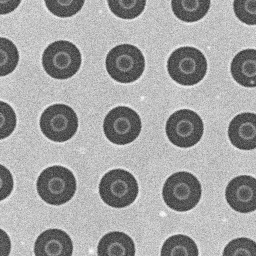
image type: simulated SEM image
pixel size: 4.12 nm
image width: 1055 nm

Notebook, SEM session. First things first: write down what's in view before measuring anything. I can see an array of small figures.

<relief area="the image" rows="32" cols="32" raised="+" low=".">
...+++....+++.....+++.....+++...
..++++....++++....++++....+++...
++++++++++++++++++++++...+++++..
++++++++++++++++++++++++++++++++
++++++++++++++++++++++++++++++++
..++++...++++++.++++++++++++++++
..+++.....++++....+++....+++++..
..+++.....+++.....+++.....+++...
..+++.....+++.....+++.....+++...
.+++++...+++++....+++.....+++...
++++++++++++++++++++++...+++++..
++++++++++++++++++++++++++++++++
++++++++++++++++++++++++++++++++
..++++...+++++..++++++++++++++++
..+++.....+++....++++....++++...
..+++.....+++.....+++....++++...
..+++.....+++.....+++....+++....
++++++...++++....++++....++++...
++++++++++++++++++++++..+++++...
++++++++++++++++++++++++++++++++
++++++++++++++++++++++++++++++++
.++++....++++...++++++..++++++++
..+++.....+++....++++....++++...
..+++.....++.....+++.....+++....
.++++....+++.....+++.....+++....
++++++..+++++...+++++....++++...
++++++++++++++++++++++.+++++++.+
++++++++++++++++++++++++++++++++
++++++++++++++++++++++++++++++++
.++++....++++...+++++..+++++++++
.+++.....+++.....+++.....+++....
.+++.....+++.....+++.....+++....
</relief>